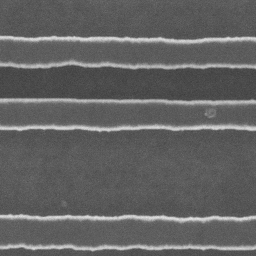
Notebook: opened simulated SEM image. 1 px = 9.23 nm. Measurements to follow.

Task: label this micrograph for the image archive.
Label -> lines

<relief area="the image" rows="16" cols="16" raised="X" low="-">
----------------
----------------
XXXXXXXXXXX-XXXX
XXXXXXXXXXXXXXXX
----------------
----------------
XXXXXXXXXXXXXXXX
XXXXXXXXXXXXXXXX
----------------
----------------
----------------
----------------
----------------
XX--X---X-------
XXXXXXXXXXXXXXXX
X-XXXXXXXXXXXXXX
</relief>